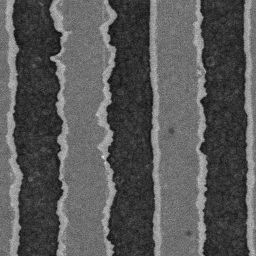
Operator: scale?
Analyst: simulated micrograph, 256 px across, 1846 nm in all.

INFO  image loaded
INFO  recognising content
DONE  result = one or a few lines or trenches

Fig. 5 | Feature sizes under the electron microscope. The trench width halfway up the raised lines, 336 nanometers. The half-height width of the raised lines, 343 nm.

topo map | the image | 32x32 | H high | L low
HHLLLLLHHHHHHLLLLLLHHHHHHLLLLLLH
HLLLLLLHHHHHHHLLLLLHHHHHHLLLLLLH
HLLLLLLHHHHHHHLLLLLHHHHHHLLLLLLH
HLLLLLLHHHHHHLLLLLLHHHHHHLLLLLLH
HLLLLLLLHHHHHLLLLLLHHHHHHLLLLLLH
HHLLLLLLHHHHHHLLLLLHHHHHHLLLLLLH
HHLLLLLHHHHHHHLLLLLHHHHHHLLLLLLH
HHLLLLLHHHHHHHLLLLLHHHHHHLLLLLLH
HHLLLLLHHHHHHHLLLLLHHHHHHHLLLLLH
HHLLLLLLHHHHHLLLLLLHHHHHHLLLLLLH
HHLLLLLLHHHHHLLLLLLHHHHHHLLLLLLH
HHLLLLLHHHHHHLLLLLLHHHHHHLLLLLLH
HHLLLLLHHHHHHLLLLLLLHHHHHLLLLLLH
HHLLLLLLHHHHHLLLLLLHHHHHHLLLLLLH
HHLLLLLLHHHHHLLLLLLHHHHHHLLLLLLH
HHLLLLLLHHHHHLLLLLLHHHHHHLLLLLLH
HLLLLLLLHHHHHHLLLLLHHHHHHLLLLLLH
HLLLLLLLHHHHHHLLLLLHHHHHHLLLLLLH
HHLLLLLLHHHHHLLLLLLHHHHHHLLLLLLH
HHLLLLLLHHHHHLLLLLLLHHHHHLLLLLLH
HHLLLLLLHHHHHLLLLLLHHHHHHLLLLLLH
HHLLLLLLHHHHHHLLLLLHHHHHHLLLLLLH
HHLLLLLLHHHHHHLLLLLHHHHHHLLLLLLH
HHLLLLLLHHHHHHLLLLLLHHHHHLLLLLLH
HHLLLLLLHHHHHHLLLLLLHHHHHLLLLLLH
HHLLLLLHHHHHHHLLLLLLHHHHHLLLLLLH
HHLLLLLHHHHHHLLLLLLLHHHHHLLLLLLH
HHLLLLLLHHHHHLLLLLLLHHHHHLLLLLLH
HHLLLLLLHHHHHLLLLLLLHHHHHLLLLLLH
HHLLLLLHHHHHHLLLLLLLHHHHHLLLLLLH
HHLLLLLLHHHHHHLLLLLLHHHHHLLLLLLH
HHLLLLLHHHHHHHLLLLLHHHHHHLLLLLLH